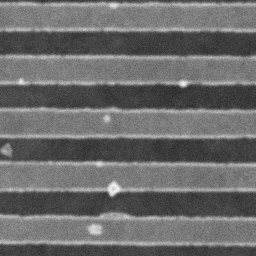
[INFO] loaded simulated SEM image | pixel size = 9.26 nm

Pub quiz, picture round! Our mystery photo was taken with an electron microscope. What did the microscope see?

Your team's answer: lines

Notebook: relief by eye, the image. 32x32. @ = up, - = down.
@@@@@-@@@@@@@@@---@@@@@-@@@-@@-@
@@@@@@@@@@@@@@@@@@@@@@@@@@@@@@@@
@@@@@@@@@@@@@@@@@@@@@@@@@@@@@@@@
@@@@@@@@@@@@@@@@@@@@@@@@@@@@@@@@
--------------------------------
--------------------------------
--------------------------------
@@@@@@@@@@@@@@@@@@@@@@@@@@@@@@@@
@@@@@@@@@@@@@@@@@@@@@@@@@@@@@@@@
@@@@@@@@@@@@@@@@@@@@@@@@@@@@@@@@
----------------------@@--------
--------------------------------
--------------------------------
--------------------------------
@@@@@@@@@@@@@@@@@@@@@@@@@@@@@@@@
@@@@@@@@@@@@@@@@@@@@@@@@@@@@@@@@
@@@@@@@@@@@@@@@@@@@@@@@@@@@@@@@@
--------------------------------
--------------------------------
--------------------------------
@@@@@@@@@@@@@@@-@--@------------
@@@@@@@@@@@@@@@@@@@@@@@@@@@@@@@@
@@@@@@@@@@@@@@@@@@@@@@@@@@@@@@@@
@@@@@@@@@@@@@@@@@@@@@@@@@@@@@@@@
--------------------------------
--------------------------------
--------------------------------
@@@@@@@@@@@@@@@@@@@@@@@@@@@@@@@@
@@@@@@@@@@@@@@@@@@@@@@@@@@@@@@@@
@@@@@@@@@@@@@@@@@@@@@@@@@@@@@@@@
-----------------------------@@@
--------------------------------